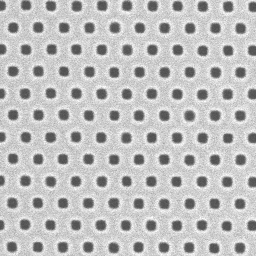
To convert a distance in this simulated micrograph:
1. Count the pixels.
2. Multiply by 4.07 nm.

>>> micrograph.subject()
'a regular array of holes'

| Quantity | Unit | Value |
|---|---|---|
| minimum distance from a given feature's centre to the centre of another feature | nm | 101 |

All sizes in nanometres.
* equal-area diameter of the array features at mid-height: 44.8